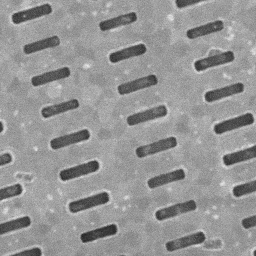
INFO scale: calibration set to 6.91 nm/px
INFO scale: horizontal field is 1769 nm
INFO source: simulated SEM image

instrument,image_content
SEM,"a regular array of holes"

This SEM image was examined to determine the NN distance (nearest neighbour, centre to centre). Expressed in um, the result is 0.226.